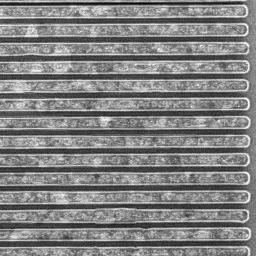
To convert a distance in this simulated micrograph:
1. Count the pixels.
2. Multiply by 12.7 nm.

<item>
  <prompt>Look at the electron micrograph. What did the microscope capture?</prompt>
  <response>parallel lines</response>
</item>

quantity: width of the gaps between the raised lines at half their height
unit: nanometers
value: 93.3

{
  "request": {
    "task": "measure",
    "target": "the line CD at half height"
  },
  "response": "142 nm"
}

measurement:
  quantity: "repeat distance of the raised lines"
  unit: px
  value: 18.6